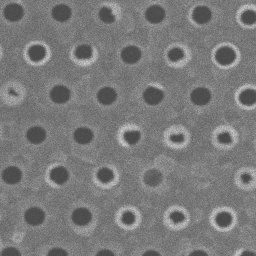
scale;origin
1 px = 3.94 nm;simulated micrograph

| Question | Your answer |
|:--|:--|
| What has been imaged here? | a regular array of holes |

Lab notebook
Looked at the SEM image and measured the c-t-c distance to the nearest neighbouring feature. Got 182 nm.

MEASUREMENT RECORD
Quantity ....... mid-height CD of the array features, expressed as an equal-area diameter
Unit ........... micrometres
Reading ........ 0.0742